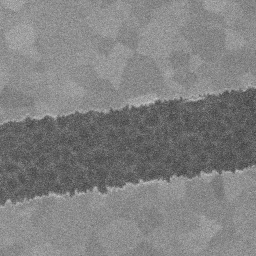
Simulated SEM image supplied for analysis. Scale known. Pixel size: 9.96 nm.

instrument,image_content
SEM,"one or a few lines or trenches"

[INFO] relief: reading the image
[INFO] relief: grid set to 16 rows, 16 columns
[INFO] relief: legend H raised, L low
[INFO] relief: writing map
HHHHHHHHHHHHHHHH
HHHHHHHHHHHHHHHH
HHHHHHHHHHHHHHHH
HHHHHHHHHHHHHHHH
HHHHHHHHHHHHHHHH
HHHHHHHHHHHHHHHH
HHHHHHHHHLLLHLLL
HLLLLLLLLHLLLLLL
LLLLLLLLLLLLLLLL
LLLLLLLLLLLLLLLL
LLLLLLLLLLLLLLLL
LLLLLLLLHHHHHHHH
LLHHHHHHHHHHHHHH
HHHHHHHHHHHHHHHH
HHHHHHHHHHHHHHHH
HHHHHHHHHHHHHHHH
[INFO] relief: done